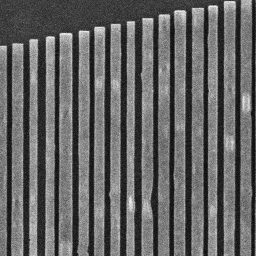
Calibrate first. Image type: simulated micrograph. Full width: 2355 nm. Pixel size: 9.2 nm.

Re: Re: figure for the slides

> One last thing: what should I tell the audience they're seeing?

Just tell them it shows parallel lines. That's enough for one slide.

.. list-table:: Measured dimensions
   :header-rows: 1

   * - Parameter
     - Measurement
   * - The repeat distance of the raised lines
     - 150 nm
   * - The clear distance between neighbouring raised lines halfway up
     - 56.3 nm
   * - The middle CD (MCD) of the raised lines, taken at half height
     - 95.4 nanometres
